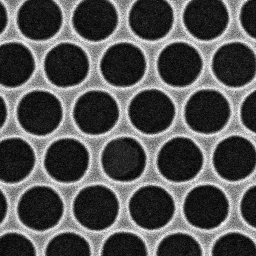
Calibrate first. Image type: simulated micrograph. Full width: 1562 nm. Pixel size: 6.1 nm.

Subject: a regular array of holes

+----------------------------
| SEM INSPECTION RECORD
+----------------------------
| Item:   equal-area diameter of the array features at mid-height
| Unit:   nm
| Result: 277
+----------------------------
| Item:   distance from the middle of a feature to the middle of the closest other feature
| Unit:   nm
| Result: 332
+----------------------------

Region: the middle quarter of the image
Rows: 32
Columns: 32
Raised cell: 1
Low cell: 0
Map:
00000001100000000000011000000000
00000011100000000000111000000000
00000011100000000000111100000000
00000111110000000001111100000000
00001111111000000011111110000000
00111111111110000111111111100001
11111111111111111111000011111111
11111000000111111100000001111111
11110000000011111000000000011110
11100000000001111000000000011110
11100000000000110000000000001100
11000000000000110000000000001100
11000000000000110000000000001100
11000000000000110000000000011100
11100000000001111000000000011110
11100000000011111000000000111110
11110000000111111100000001111111
11111100001111111111100111111111
00111111111111000111111111100001
00001111111000000001111111000000
00000111110000000001111110000000
00000011110000000000111100000000
00000011100000000000111000000000
00000011100000000000011000000000
00000011100000000000011000000000
00000011100000000000111000000000
00000011110000000000111100000000
00000111111000000000111100000000
00001111111100000011111110000000
00011111111111101111111111100011
11111100001111111111000111111111
11110000000011111100000001111111